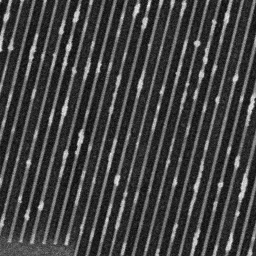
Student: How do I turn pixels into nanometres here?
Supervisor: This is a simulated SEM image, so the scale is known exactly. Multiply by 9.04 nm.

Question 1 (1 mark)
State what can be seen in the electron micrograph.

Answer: parallel lines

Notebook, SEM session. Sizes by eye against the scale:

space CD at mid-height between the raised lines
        0.0724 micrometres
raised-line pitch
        102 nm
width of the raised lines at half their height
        27.4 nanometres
